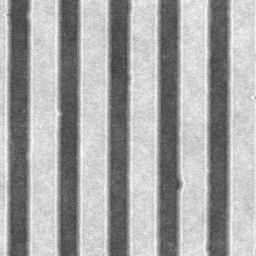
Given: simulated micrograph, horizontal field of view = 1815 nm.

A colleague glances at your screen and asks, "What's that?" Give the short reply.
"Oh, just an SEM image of parallel lines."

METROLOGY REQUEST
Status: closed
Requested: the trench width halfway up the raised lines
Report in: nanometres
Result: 145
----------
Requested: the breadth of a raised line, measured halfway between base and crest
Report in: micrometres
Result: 0.204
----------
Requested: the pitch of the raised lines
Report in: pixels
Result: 49.9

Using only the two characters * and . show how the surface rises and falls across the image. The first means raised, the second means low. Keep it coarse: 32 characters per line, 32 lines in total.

*...***...****..****..****...***
*...***...****..****..****...***
*...***...****..****..****...***
*...***...****..****..****...***
*...***...****..****..****...***
*...***...****..****..****...***
*...***...****..****..****...***
*...***...****..****..****...***
*...***...****..****..****...***
*...***...****..****..****...***
*...***...****..****..****...***
*...***...****..****..****...***
*...***...****..****..****...***
*...***...****..****..****...***
*...***...****..****..****...***
*...***...***...****..****...***
*...***...***...****..****...***
*...***...***...****..****...***
*...***...***...****..****...***
*...***...***...****..****...***
*...***...***...****..****...***
*...***...***...****..****...***
*...***...***...****...***...***
*...***...***...****...***...***
*...***...***...****..****...***
*...***...***...****..****...***
*...***...***...****..****...***
*...***...***...****..****...***
*...***...***...****..****...***
*...***...***...****..****...***
*...***...***...****..****...***
*...***...***...****..****...***